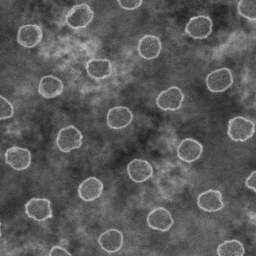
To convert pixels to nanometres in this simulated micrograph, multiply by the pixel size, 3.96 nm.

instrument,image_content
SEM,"a regular array of raised bodies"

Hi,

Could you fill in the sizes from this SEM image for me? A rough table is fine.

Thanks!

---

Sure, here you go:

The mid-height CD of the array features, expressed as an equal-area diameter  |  90.4 nanometers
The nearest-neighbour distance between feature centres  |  0.211 micrometres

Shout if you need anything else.